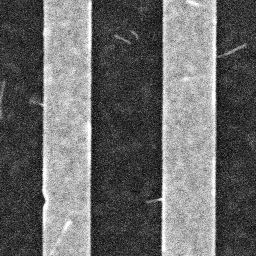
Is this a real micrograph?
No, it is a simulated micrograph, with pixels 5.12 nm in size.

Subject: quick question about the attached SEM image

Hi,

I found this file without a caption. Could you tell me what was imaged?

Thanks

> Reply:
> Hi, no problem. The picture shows one or a few lines or trenches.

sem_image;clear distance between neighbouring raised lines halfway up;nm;374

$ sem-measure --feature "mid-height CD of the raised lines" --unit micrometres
0.253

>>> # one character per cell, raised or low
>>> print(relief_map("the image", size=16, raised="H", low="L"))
LLLHHHLLLLHHHLLL
LLLHHHLLLLHHHLLL
LLLHHHLLLLHHHLLL
LLLHHHLLLLHHHLLL
LLLHHHLLLLHHHLLL
LLLHHHLLLLHHHLLL
LLLHHHLLLLHHHLLL
LLLHHHLLLLHHHLLL
LLLHHHLLLLHHHLLL
LLLHHHLLLLHHHLLL
LLLHHHLLLLHHHLLL
LLLHHHLLLLHHHLLL
LLLHHHLLLLHHHLLL
LLLHHHLLLLHHHLLL
LLLHHHLLLLHHHLLL
LLLHHHLLLLHHHLLL